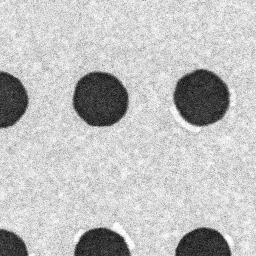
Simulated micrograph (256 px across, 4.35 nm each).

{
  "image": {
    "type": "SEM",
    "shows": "holes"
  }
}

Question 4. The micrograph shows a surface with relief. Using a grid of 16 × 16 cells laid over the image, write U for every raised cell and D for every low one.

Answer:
UUUUUUUUUUUUUUUU
UUUUUUUUUUUUUUUU
UUUUUUUUUUUUUUUU
UUUUUUUUUUUUUUUU
UUUUUUUUUUUUDUUU
DDUUUDDDUUUDDDUU
DDUUUDDDUUUDDDUU
DUUUUDDUUUUUDDUU
UUUUUUUUUUUUUUUU
UUUUUUUUUUUUUUUU
UUUUUUUUUUUUUUUU
UUUUUUUUUUUUUUUU
UUUUUUUUUUUUUUUU
UUUUUUUUUUUUUUUU
DUUUUDDUUUUUDDUU
DDUUUDDDUUUDDDUU